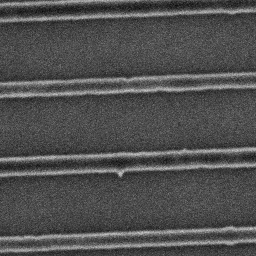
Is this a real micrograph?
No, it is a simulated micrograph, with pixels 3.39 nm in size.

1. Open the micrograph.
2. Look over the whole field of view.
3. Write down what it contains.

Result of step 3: one or a few lines or trenches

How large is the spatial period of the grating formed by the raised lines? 262 nanometres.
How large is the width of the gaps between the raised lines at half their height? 210 nanometres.